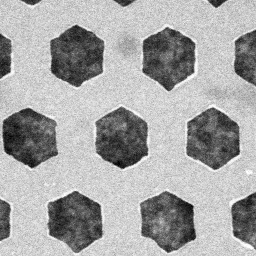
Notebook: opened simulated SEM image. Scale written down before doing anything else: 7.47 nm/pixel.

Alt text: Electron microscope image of holes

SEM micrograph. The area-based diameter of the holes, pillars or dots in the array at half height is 431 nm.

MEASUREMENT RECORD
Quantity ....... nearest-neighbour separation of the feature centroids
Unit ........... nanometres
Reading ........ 687